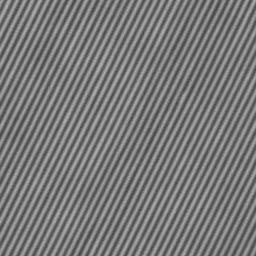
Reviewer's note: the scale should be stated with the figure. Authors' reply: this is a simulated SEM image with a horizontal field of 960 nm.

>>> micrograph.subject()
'parallel lines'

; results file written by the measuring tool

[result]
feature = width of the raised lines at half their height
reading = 10.1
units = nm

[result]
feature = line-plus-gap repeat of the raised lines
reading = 25.8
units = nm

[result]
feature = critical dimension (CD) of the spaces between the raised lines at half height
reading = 0.016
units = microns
